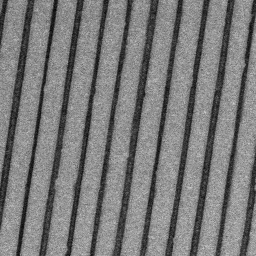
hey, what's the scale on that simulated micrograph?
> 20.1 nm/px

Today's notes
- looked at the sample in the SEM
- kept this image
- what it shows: parallel lines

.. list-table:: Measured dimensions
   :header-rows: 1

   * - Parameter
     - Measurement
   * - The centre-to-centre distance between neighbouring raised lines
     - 498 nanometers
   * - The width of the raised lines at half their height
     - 18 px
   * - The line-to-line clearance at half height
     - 5.93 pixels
